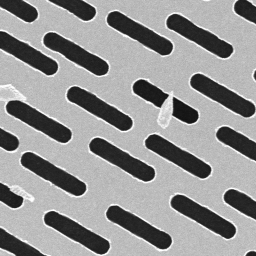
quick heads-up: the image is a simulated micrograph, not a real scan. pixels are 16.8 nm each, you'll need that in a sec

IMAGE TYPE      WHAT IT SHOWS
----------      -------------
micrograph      a regular array of holes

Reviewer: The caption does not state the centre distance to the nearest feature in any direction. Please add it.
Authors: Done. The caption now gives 992 nanometres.